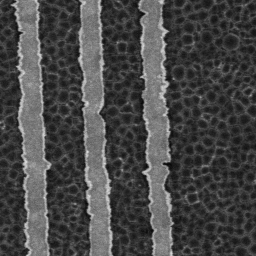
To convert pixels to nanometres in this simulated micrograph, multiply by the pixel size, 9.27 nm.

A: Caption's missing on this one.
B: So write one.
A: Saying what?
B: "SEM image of one or a few lines or trenches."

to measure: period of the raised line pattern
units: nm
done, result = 573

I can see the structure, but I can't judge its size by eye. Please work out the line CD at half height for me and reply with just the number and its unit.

189 nm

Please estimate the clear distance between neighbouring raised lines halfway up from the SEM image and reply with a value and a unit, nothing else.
0.386 micrometres